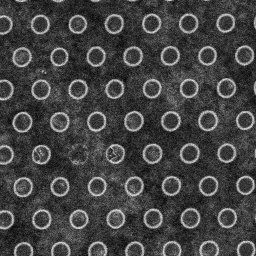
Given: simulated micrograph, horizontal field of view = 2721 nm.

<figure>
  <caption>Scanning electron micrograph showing a regular array of raised bodies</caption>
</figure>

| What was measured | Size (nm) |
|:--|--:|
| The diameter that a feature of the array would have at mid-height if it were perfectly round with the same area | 192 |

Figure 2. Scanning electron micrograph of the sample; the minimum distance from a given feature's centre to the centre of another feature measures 393 nm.